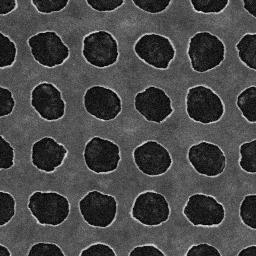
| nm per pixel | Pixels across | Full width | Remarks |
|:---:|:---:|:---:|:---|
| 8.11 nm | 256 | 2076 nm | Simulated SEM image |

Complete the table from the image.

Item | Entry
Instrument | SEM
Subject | a regular array of holes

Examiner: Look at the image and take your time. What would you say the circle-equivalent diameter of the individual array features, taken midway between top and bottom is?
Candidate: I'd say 288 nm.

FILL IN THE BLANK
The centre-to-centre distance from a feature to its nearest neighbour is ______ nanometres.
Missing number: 409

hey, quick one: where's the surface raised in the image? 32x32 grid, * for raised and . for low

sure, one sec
..**....***....**....***....**..
.****..************.*****..****.
********************************
********************************
.***...****...****..****...****.
..**....**.....**.....**....**..
..**.....*.....**.....*.....**..
..***...***....***....**....**..
*******************..***..*****.
********************************
*****.**************************
.***...****...****..****...***..
..**....**.....**....**.....**..
..**....***....**.....*.....**..
*****...****...***...***....***.
********************************
********************************
.****..****..*******************
..**....***....**....***...***..
..**....***....**....***....**..
..**....***....**....***....**..
************..****...****...***.
********************************
********************************
.***....***...***...****..*****.
..**.....*.....**....**....***..
..**.....*.....*.....**.....**..
.****...***...***....***....**..
*******************************.
********************************
*****..*****.************.******
.***....**....**....***....***..